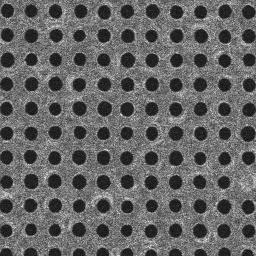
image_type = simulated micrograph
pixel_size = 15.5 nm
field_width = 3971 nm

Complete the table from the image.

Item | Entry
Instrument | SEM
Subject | a regular array of holes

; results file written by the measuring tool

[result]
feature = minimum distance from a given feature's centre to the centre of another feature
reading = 369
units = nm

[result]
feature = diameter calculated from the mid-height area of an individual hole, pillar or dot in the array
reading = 212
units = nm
